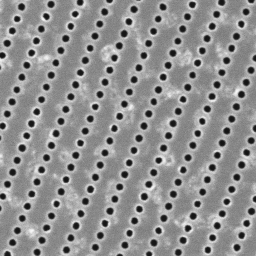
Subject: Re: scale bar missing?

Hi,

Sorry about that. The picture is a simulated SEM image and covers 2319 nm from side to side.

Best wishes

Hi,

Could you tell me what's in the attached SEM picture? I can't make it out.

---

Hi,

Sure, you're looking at a regular array of holes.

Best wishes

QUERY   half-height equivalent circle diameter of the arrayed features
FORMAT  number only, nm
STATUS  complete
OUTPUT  66.3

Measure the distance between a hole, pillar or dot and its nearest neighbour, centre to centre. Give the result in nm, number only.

117